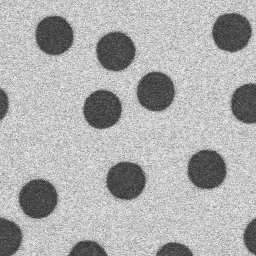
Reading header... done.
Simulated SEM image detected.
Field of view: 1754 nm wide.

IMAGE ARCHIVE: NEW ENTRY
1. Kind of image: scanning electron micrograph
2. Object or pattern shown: a regular array of holes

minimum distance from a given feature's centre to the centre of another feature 474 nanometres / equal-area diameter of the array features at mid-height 268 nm